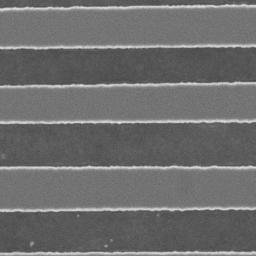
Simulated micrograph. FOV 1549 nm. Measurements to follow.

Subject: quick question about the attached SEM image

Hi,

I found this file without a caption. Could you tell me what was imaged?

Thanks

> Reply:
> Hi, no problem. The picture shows lines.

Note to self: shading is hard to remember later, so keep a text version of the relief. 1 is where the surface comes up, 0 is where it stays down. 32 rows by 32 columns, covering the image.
00000000000000000000000000000000
11111111111111111111111111111111
11111111111111111111111111111111
11111111111111111111111111111111
11111111111111111111111111111111
11111111111111111111111111111111
00000000000000000000000000000000
00000000000000000000000000000000
00000000000000000000000000000000
00000000000000000000000000000000
00000000000000010111111111111111
11111111111111111111111111111111
11111111111111111111111111111111
11111111111111111111111111111111
11111111111111111111111111111111
00000000000000000000000000000000
00000000000000000000000000000000
00000000000000000000000000000000
00000000000000000000000000000000
00000000000000000000000000000000
00000000000000000000000000000000
11111111111111111111111111111111
11111111111111111111111111111111
11111111111111111111111111111111
11111111111111111111111111111111
11111111111111111111111111111111
00000000000000000000000000000000
00000000000000000000000000000000
00000000000000000000000000000000
00000000000000000000000000000000
00000000000000000000000000000000
00000000000000000000010110010001